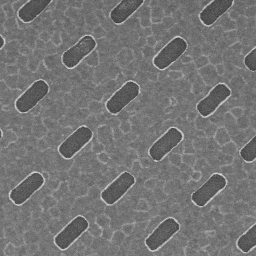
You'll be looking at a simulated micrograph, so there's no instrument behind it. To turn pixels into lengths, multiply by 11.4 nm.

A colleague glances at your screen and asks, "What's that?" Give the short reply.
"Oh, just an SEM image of a regular array of holes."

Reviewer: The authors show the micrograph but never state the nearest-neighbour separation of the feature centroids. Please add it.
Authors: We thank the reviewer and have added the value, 720 nm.